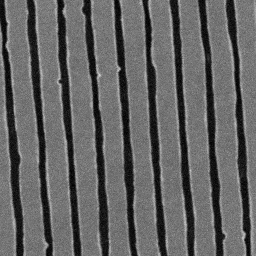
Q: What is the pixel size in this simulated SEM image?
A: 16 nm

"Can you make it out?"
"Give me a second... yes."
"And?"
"parallel lines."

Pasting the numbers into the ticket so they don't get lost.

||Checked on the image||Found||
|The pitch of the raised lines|458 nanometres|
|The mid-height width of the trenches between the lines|122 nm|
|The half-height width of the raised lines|334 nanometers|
